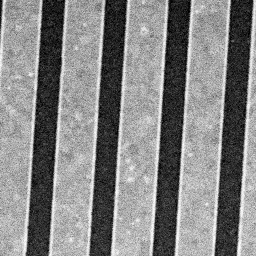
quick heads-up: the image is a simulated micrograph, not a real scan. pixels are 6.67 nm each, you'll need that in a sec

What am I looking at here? one or a few lines or trenches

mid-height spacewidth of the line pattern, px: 25.4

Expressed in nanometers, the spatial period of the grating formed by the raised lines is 418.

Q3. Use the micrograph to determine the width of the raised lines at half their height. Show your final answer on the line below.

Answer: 247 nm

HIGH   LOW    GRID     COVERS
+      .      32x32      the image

.++++...+++++...+++++...+++++...
.++++...+++++...+++++...+++++...
+++++...+++++...+++++...++++....
+++++...+++++...+++++...++++....
+++++...+++++...+++++...++++....
+++++...+++++...+++++...++++....
+++++...+++++...+++++...++++...+
+++++...++++....++++....++++...+
+++++...++++....++++...+++++...+
++++....++++....++++...+++++...+
++++....++++...+++++...+++++...+
++++....++++...+++++...+++++...+
++++....++++...+++++...+++++...+
++++....++++...+++++...+++++...+
++++...+++++...+++++...+++++...+
++++...+++++...+++++...+++++...+
++++...+++++...+++++...+++++...+
++++...+++++...+++++...++++....+
++++...+++++...+++++...++++....+
++++...+++++...+++++...++++....+
++++...+++++...+++++...++++....+
++++...+++++...+++++...++++....+
++++...+++++...+++++...++++...++
++++...++++....++++....++++...++
++++...++++....++++...+++++...++
+++....++++....++++...+++++...++
+++....++++...+++++...+++++...++
+++....++++...+++++...+++++...++
+++....++++...+++++...+++++...++
+++...+++++...+++++...+++++...++
+++...+++++...+++++...+++++...++
+++...+++++...+++++...+++++...++